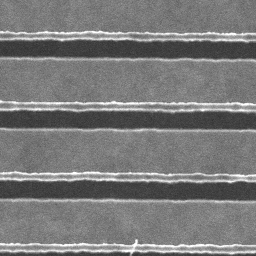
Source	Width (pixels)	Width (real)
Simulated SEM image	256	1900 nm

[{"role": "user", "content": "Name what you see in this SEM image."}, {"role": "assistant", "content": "lines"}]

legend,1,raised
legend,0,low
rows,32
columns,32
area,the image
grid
11111111111111111111111111111111
11111111111111111111111111111111
11111111111111111111111111111111
11111111111111111111111111111111
11111111111111111111111111111111
00000000000000000000000000000000
00000000000000000000000000000000
11111111111111111111101101000000
11111111111111111111111111111111
11111111111111111111111111111111
11111111111111111111111111111111
11111111111111111111111111111111
11111111111111111111111111111111
11111111111111111111111111111111
00000000000000000000000000000000
00000000000000000000000000000000
11111111111111111111111111111111
11111111111111111111111111111111
11111111111111111111111111111111
11111111111111111111111111111111
11111111111111111111111111111111
11111111111111111111111111111111
00101111110111111111111111111111
00000000000000000000000000000000
00000000000000000000000000000000
11111111111111111111111111111111
11111111111111111111111111111111
11111111111111111111111111111111
11111111111111111111111111111111
11111111111111111111111111111111
11111111111111111111111111111111
00000000000000001000101111111111